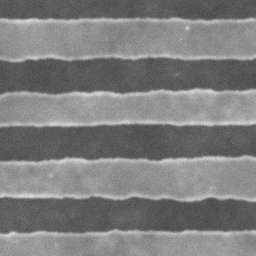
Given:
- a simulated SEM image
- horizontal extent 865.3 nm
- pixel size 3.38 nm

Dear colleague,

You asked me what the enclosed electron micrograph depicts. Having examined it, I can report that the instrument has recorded lines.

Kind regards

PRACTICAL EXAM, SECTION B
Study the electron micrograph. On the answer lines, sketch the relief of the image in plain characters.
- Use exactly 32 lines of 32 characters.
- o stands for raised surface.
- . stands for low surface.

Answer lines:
................................
................................
o..oo.o...ooooooooooooo....o..oo
oooooooooooooooooooooooooooooooo
oooooooooooooooooooooooooooooooo
oooooooooooooooooooooooooooooooo
oooooooooooooooooooooooooooooooo
ooo.....o.......................
................................
................................
................................
..oo.....o..oo....oooooooooooooo
oooooooooooooooooooooooooooooooo
oooooooooooooooooooooooooooooooo
oooooooooooooooooooooooooooooooo
ooooooooooooooo......ooooooooooo
................................
................................
................................
..............................o.
oooooooooooooooooooooooooooooooo
oooooooooooooooooooooooooooooooo
oooooooooooooooooooooooooooooooo
oooooooooooooooooooooooooooooooo
oooooooooooooooooooooooooooooooo
................................
................................
................................
................................
oooooooooooooooooooooooooooooooo
oooooooooooooooooooooooooooooooo
oooooooooooooooooooooooooooooooo